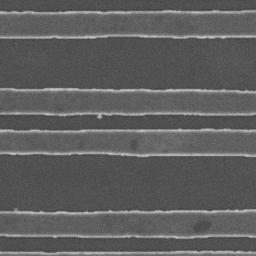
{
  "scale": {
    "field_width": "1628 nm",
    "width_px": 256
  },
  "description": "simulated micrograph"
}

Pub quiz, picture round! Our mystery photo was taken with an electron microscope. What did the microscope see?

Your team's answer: lines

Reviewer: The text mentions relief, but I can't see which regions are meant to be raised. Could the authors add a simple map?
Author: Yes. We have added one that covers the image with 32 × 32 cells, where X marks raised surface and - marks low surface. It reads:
--------------------------------
XXXXX---XXXXXXXXXXXXXXXXXXXXXXXX
XXXXXXXXXXXXXXXXXXXXXXXXXXXXXXXX
XXXXXXXXXXXXXXXXXXXXXXXXXXXXXXXX
XXXXXXXXXXXXXX---XXXXXXXXXXXXXXX
--------------------------------
--------------------------------
--------------------------------
--------------------------------
--------------------------------
--------------------------------
XXXXXXXXXXXXXXXXXXXXXXXXXXXXXXXX
XXXXXXXXXXXXXXXXXXXXXXXXXXXXXXXX
XXXXXXXXXXXXXXXXXXXXXXXXXXXXXXXX
--------------------------------
--------------------------------
XXXXXXXXXXXXXXXXXXXXXXXXXXXXXXXX
XXXXXXXXXXXXXXXXXXXXXXXXXXXXXXXX
XXXXXXXXXXXXXXXXXXXXXXXXXXXXXXXX
-----------------XX-----------XX
--------------------------------
--------------------------------
--------------------------------
--------------------------------
--------------------------------
--------------------------------
-------------X-XXX-XXXXXXXXXXXXX
XXXXXXXXXXXXXXXXXXXXXXXXXXXXXXXX
XXXXXXXXXXXXXXXXXXXXXXXXXXXXXXXX
XXXXXXXXXXXXXXXXXXXXXXXXXXXXXXXX
--------------------------------
----------------------XXXXXXXX--